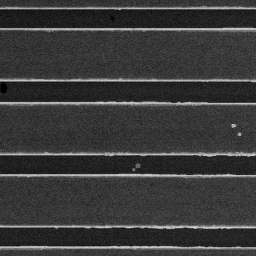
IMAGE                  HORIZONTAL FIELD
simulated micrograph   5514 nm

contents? lines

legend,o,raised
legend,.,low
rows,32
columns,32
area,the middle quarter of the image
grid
oooooooooooooooooooooooooooooooo
oooooooooooooooooooooooooooooooo
oooooooooooooooooooooooooooooooo
oooooooooooooooooooooooooooooooo
................................
................................
................................
................................
................................
................................
oooooooooooooooooooooooooooooooo
oooooooooooooooooooooooooooooooo
oooooooooooooooooooooooooooooooo
oooooooooooooooooooooooooooooooo
oooooooooooooooooooooooooooooooo
oooooooooooooooooooooooooooooooo
oooooooooooooooooooooooooooooooo
oooooooooooooooooooooooooooooooo
oooooooooooooooooooooooooooooooo
oooooooooooooooooooooooooooooooo
oooooooooooooooooooooooooooooooo
oooooooooooooooooooooooooooooooo
oooooooooooooooooooooooooooooooo
................................
................................
................................
................................
................................
oooooooooooooooooooooooooooooooo
oooooooooooooooooooooooooooooooo
oooooooooooooooooooooooooooooooo
oooooooooooooooooooooooooooooooo